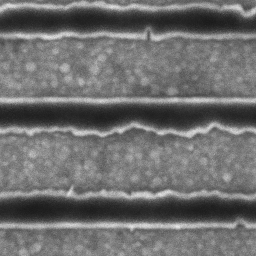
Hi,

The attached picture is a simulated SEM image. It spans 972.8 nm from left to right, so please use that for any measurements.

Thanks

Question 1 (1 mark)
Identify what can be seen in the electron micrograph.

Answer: one or a few lines or trenches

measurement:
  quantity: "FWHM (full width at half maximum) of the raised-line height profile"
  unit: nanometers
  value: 120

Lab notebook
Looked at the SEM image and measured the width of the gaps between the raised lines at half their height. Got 240 nm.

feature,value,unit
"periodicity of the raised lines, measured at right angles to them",358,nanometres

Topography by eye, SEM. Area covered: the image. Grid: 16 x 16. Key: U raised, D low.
UUUUUUUUUUUUUUUD
UUUUUUUUUUUUUUUU
DDDDDDDDDDDDDDDD
DDDDDDDDDDDDDDDD
DDDDDDDDDDDDDDDD
DDDDDDDDDDDDDDDD
UUUUUUUUUUUUUUUU
UUUUUUUUUUUUUUUU
DDDDDDDDDDDDDDDD
DDDDDDDDDDDDDDDD
DDDDDDDDDDDDDDDD
DDDDDDDDDDDDDDDD
UUUUUUUUUUUUUUUU
UUUUUUUUUUUUUUUU
DDDDDDDDDDDDDDDD
DDDDDDDDDDDDDDDD